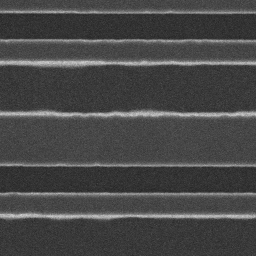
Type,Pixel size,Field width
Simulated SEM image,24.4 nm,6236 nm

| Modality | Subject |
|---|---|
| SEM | lines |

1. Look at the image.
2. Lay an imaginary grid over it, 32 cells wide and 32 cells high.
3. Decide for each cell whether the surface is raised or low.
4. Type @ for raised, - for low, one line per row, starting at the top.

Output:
@@@@@@@@@@@@@@@@@@@@@@@@@@@@@@@@
@@@@@@@@@@@@@@@@@@@@@@@@@@@@@@@@
--------------------------------
--------------------------------
--------------------------------
@@@@@@@@@@@@@@@@@@@@@@@@@@@@@@@@
@@@@@@@@@@@@@@@@@@@@@@@@@@@@@@@@
@@@@@@@@@@@@@@@@@@@@@@@@@@@@@@@@
--------------------------------
--------------------------------
--------------------------------
--------------------------------
--------------------------------
--------------------------------
@@@@@@@@@@@@@@@@@@@@@@@@@@@@@@@@
@@@@@@@@@@@@@@@@@@@@@@@@@@@@@@@@
@@@@@@@@@@@@@@@@@@@@@@@@@@@@@@@@
@@@@@@@@@@@@@@@@@@@@@@@@@@@@@@@@
@@@@@@@@@@@@@@@@@@@@@@@@@@@@@@@@
@@@@@@@@@@@@@@@@@@@@@@@@@@@@@@@@
@@@@@@@@@@@@@@@@@@@@@@@@@@@@@@@@
--------------------------------
--------------------------------
--------------------------------
@@@@@@@@@@@@@@@@@@@@@@@@@@@@@@@@
@@@@@@@@@@@@@@@@@@@@@@@@@@@@@@@@
@@@@@@@@@@@@@@@@@@@@@@@@@@@@@@@@
--------------------------------
--------------------------------
--------------------------------
--------------------------------
--------------------------------